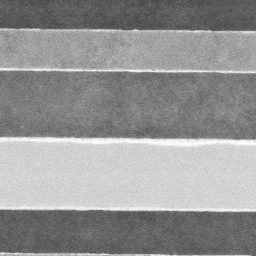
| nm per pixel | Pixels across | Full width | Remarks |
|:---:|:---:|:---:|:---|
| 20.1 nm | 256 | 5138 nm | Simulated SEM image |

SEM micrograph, lines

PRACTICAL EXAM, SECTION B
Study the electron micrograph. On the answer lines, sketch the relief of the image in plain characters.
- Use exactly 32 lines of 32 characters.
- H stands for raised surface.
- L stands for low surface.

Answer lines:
LLLLLLLLLLLLLLLLLLLLLLLLLLLLLLLL
LLLLLLLLLLLLLLLLLLLLLLLLLLLLLLLL
LLLLLLLLLLLLLLLLLLLLLLLLLLLLLLLL
LLLLLLLLLLLLLLLLLLLLLLLLLLLLLLLL
HHHHHHHHHHHHHHHHHHHHHHHHHHHHHHHH
HHHHHHHHHHHHHHHHHHHHHHHHHHHHHHHH
HHHHHHHHHHHHHHHHHHHHHHHHHHHHHHHH
HHHHHHHHHHHHHHHHHHHHHHHHHHHHHHHH
HHHHHHHHHHHHHHHHHHHHHHHHHHHHHHHH
LLLLLLLLLLLLLLLLLLLLLLLLLLLLLLLL
LLLLLLLLLLLLLLLLLLLLLLLLLLLLLLLL
LLLLLLLLLLLLLLLLLLLLLLLLLLLLLLLL
LLLLLLLLLLLLLLLLLLLLLLLLLLLLLLLL
LLLLLLLLLLLLLLLLLLLLLLLLLLLLLLLL
LLLLLLLLLLLLLLLLLLLLLLLLLLLLLLLL
LLLLLLLLLLLLLLLLLLLLLLLLLLLLLLLL
LLLLLLLLLLLLLLLLLLLLLLLLLLLLLLLL
HHHHHHHHHHHHHHHHLLLLLLLLLLLLLLLL
HHHHHHHHHHHHHHHHHHHHHHHHHHHHHHHH
HHHHHHHHHHHHHHHHHHHHHHHHHHHHHHHH
HHHHHHHHHHHHHHHHHHHHHHHHHHHHHHHH
HHHHHHHHHHHHHHHHHHHHHHHHHHHHHHHH
HHHHHHHHHHHHHHHHHHHHHHHHHHHHHHHH
HHHHHHHHHHHHHHHHHHHHHHHHHHHHHHHH
HHHHHHHHHHHHHHHHHHHHHHHHHHHHHHHH
HHHHHHHHHHHHHHHHHHHHHHHHHHHHHHHH
LLLLLLLLLLLLLLLLLLLLLLLLLLLLLLLL
LLLLLLLLLLLLLLLLLLLLLLLLLLLLLLLL
LLLLLLLLLLLLLLLLLLLLLLLLLLLLLLLL
LLLLLLLLLLLLLLLLLLLLLLLLLLLLLLLL
LLLLLLLLLLLLLLLLLLLLLLLLLLLLLLLL
LLLLLLLLLLLLLLLLLLLLLLLLLLLLLLLL